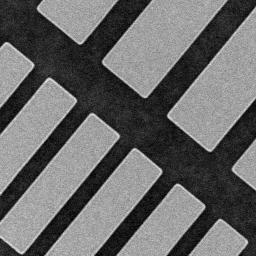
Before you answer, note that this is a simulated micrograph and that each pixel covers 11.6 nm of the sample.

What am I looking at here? groups of lines, slits or small figures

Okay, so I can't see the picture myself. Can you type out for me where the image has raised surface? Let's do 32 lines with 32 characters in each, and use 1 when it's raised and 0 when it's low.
00000111111111000001111111110000
00000111111111000011111111100001
00000011111110000111111111000001
00000001111100001111111111000011
00000000011000011111111110000111
00000000000000011111111100001111
11000000000000111111111000011111
11110000000001111111110000011111
11110000000000111111100000111111
11100000000000011111100001111111
11000110000000001111000011111111
11000111000000000110000111111111
10001111100000000000001111111111
00011111100000000000001111111110
00111111000100000000011111111100
01111110001110000000001111111000
11111100011111000000000111110000
11111100011111100000000011110000
11111000111111000000000000100001
11110001111110001100000000000011
11100011111100011110000000000111
11000111111000111111000000000111
11001111111001111111000000000011
10001111110001111110001000000000
00011111100011111100011100000000
00111111000111111000111110000000
01111110001111110001111110000000
11111100011111100011111100000000
11111100111111100111111100111000
11111000111111000111111000111100
01110001111110001111110001111110
00100011111100011111100011111100